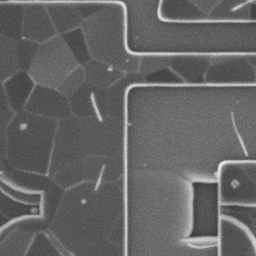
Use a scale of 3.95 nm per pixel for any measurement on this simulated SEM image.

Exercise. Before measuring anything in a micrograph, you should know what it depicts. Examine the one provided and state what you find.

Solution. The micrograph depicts wiring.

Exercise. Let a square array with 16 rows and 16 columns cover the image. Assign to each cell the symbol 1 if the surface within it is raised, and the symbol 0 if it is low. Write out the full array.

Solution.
1111111100111111
1111111100000000
1111111100000000
1111111111111111
1111111111111111
1111111100000000
1111111100000000
1111111100000000
1111111100000000
1111111100000000
1111111100000011
1111111100000011
0001111100000011
0011111100000000
1111111100000010
1111111100000011